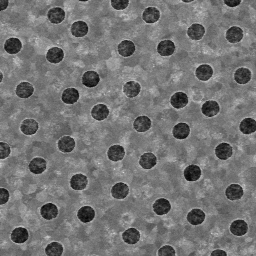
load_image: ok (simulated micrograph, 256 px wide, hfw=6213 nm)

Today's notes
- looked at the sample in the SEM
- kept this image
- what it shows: a regular array of holes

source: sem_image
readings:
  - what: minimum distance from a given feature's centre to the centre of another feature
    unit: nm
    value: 868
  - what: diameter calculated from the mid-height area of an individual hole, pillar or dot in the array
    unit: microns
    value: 0.432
